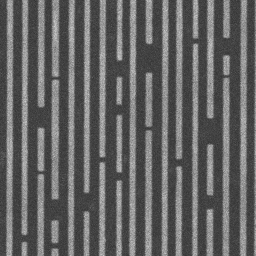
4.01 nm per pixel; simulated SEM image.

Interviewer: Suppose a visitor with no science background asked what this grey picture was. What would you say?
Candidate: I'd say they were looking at parallel lines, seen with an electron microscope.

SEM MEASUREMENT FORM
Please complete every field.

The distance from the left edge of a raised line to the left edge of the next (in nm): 62.5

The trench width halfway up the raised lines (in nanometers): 41.1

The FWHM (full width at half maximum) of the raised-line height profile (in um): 0.0235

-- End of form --